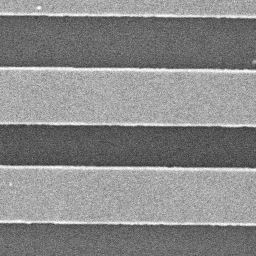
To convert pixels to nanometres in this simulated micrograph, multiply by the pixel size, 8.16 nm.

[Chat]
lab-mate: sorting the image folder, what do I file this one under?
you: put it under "lines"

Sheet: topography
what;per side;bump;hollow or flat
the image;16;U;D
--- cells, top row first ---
UUUUUUUUUUUUUUUU
DDDDDDDDDDDDDDDD
DDDDDDDDDDDDDDDD
DDDDDDDDDDDDDDDD
UUUUUUUUUUUUUUUU
UUUUUUUUUUUUUUUU
UUUUUUUUUUUUUUUU
UUUUUUUUUUUUUUUU
DDDDDDDDDDDDDDDD
DDDDDDDDDDDDDDDD
UUUUUUUUUUUDDDDD
UUUUUUUUUUUUUUUU
UUUUUUUUUUUUUUUU
UUUUUUUUUUUUUUUU
DDDDDDDDDDDDDDDD
DDDDDDDDDDDDDDDD